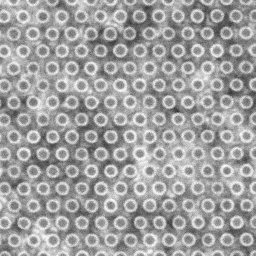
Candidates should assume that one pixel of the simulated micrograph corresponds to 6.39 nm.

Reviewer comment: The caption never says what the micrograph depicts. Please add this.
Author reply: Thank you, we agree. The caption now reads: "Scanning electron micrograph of a regular array of raised bodies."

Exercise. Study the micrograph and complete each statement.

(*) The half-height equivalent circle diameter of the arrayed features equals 11.6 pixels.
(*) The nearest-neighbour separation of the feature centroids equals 123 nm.